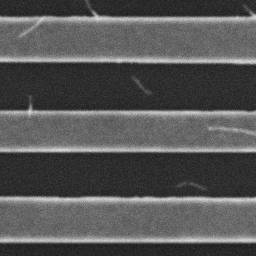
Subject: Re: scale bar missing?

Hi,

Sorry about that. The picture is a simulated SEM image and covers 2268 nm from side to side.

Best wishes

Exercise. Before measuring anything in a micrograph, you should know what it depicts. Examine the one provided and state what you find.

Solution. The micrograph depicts lines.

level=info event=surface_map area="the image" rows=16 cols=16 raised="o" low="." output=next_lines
................
oooooooooooooooo
oooooooooooooooo
oooooooooooooooo
................
................
................
oooooooooooooooo
oooooooooooooooo
................
................
................
oooooooooooooooo
oooooooooooooooo
oooooooooooooooo
................